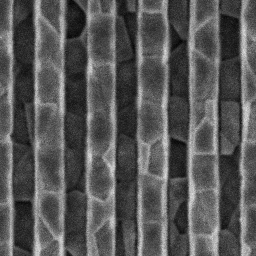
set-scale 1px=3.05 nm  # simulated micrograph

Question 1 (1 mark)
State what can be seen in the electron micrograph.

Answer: parallel lines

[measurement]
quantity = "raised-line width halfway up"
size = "0.0823 micrometres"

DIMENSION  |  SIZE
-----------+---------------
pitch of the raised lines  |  157 nanometers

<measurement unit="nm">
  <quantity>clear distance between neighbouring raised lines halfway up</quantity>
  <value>74.3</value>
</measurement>